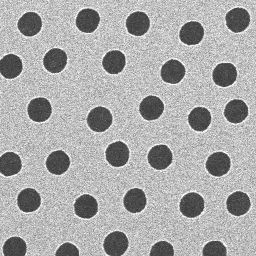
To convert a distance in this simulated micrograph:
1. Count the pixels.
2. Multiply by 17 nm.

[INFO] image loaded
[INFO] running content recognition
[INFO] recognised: a regular array of holes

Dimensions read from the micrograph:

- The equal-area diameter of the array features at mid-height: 417 nanometers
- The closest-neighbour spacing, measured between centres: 756 nm